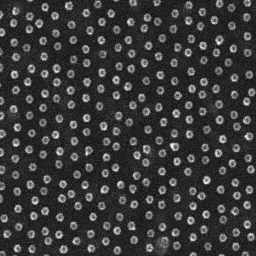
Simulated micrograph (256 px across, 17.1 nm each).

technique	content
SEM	a regular array of raised bodies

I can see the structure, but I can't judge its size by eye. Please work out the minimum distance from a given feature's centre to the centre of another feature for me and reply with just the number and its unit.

231 nm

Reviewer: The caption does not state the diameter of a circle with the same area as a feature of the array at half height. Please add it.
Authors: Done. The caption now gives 0.117 micrometres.